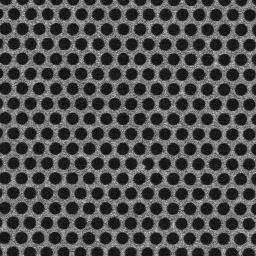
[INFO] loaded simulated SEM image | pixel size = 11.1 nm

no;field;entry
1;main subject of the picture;a regular array of holes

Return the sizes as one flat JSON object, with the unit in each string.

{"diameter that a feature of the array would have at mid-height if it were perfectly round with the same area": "138 nanometers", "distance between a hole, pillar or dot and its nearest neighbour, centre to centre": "185 nanometers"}